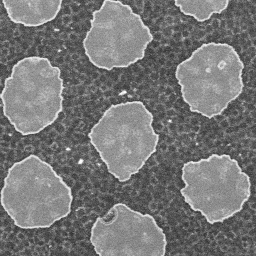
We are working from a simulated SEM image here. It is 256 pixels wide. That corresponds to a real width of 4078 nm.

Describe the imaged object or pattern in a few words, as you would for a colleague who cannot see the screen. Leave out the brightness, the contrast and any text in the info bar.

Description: raised bodies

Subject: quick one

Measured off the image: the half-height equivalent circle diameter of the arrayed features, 1070 nm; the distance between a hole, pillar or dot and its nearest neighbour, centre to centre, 1620 nm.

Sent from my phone